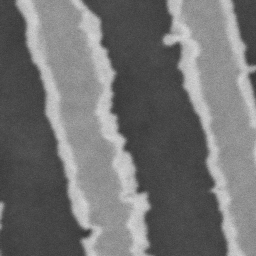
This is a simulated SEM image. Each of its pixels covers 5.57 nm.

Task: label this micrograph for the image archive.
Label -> one or a few lines or trenches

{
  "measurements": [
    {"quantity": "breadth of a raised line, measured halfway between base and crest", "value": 287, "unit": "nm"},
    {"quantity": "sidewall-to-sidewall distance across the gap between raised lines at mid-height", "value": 486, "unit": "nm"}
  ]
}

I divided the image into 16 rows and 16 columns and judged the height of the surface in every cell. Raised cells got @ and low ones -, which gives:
--@@@------@@@--
--@@@------@@@--
--@@@@-----@@@@-
--@@@@------@@@-
---@@@@-----@@@-
---@@@@-----@@@-
---@@@@-----@@@@
---@@@@------@@@
----@@@------@@@
----@@@@-----@@@
----@@@@-----@@@
-----@@@------@@
-----@@@@-----@@
-----@@@@-----@@
------@@@-----@@
------@@@-----@@